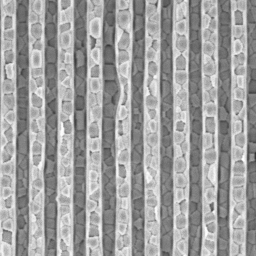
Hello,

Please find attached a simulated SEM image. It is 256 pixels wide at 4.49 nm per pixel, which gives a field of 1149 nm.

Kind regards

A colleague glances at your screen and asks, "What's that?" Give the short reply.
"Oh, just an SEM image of parallel lines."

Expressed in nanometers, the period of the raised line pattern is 129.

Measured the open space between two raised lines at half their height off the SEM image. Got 62.3 nm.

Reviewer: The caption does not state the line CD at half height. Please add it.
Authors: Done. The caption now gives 66.8 nm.